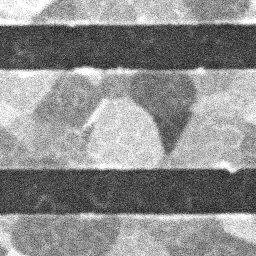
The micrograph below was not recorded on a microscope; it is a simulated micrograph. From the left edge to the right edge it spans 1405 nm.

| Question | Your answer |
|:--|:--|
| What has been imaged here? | one or a few lines or trenches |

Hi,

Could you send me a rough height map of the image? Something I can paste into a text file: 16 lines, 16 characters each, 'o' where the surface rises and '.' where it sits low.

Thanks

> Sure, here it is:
oooooooooooooooo
....o...........
................
................
oooooooooooooooo
oooooooooooooooo
oooooooooooooooo
oooooooooooooooo
oooooooooooooooo
oooooooooooooooo
.....ooo......o.
................
................
ooo.ooo.oo..oooo
oooooooooooooooo
oooooooooooooooo